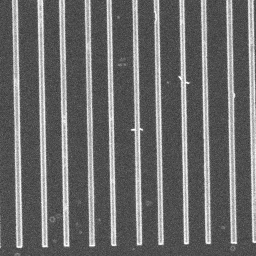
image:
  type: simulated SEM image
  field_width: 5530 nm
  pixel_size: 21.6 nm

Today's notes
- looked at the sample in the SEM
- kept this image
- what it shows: parallel lines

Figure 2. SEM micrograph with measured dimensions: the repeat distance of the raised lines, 512 nm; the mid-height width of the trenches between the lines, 19.1 px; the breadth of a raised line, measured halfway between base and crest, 94.5 nanometers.